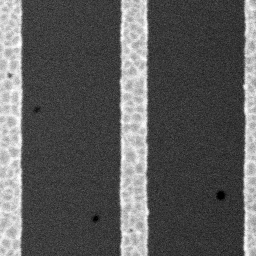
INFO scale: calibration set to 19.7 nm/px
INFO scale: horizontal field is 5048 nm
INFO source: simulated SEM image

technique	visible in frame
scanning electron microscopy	one or a few lines or trenches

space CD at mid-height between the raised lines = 1980 nm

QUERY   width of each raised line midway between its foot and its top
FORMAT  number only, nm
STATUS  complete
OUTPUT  444